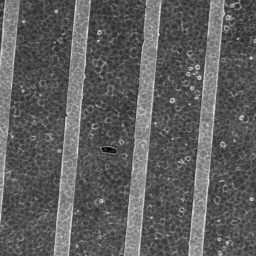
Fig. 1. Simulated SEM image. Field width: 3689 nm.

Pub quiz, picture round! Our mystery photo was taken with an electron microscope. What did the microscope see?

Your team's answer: one or a few lines or trenches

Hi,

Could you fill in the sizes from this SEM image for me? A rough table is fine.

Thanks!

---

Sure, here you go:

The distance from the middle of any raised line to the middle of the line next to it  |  968 nanometers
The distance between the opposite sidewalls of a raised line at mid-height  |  210 nm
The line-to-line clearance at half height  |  797 nm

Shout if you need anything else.